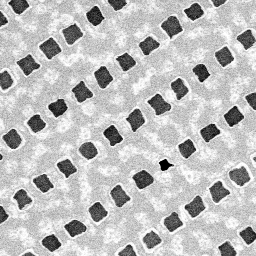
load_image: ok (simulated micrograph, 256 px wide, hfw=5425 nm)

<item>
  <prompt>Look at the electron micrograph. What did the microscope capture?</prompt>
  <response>a regular array of holes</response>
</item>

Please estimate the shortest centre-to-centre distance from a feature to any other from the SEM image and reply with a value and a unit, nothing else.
577 nm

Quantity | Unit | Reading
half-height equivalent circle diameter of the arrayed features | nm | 393